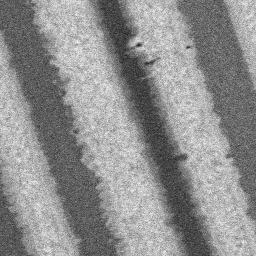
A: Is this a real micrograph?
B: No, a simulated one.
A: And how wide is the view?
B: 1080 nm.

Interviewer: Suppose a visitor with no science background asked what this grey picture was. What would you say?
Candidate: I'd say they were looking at one or a few lines or trenches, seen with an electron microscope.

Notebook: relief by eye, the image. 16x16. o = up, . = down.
..oooo..ooo....o
...ooo..ooo....o
...oooo.oooo...o
...oooo..ooo....
o...ooo..ooo....
o...oooo..ooo...
o...oooo..ooo...
oo...ooo..ooo...
oo...oooo..ooo..
oo....ooo..ooo..
ooo...ooo...oo..
.oo....ooo..ooo.
.oo....ooo..ooo.
.ooo...ooo...oo.
..oo...oooo..ooo
..ooo...ooo..ooo